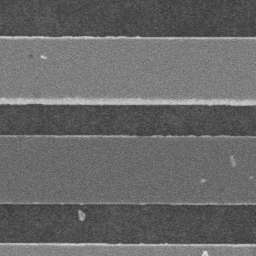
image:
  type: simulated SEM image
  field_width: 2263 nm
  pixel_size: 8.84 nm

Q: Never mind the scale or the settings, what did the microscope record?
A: lines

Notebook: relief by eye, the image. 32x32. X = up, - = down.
--------------------------------
--------------------------------
--------------------------------
--------------------------------
--------------------------------
XXXXXXXXXXXXXXXXXXXXXXXXXXXXXXXX
XXXXXXXXXXXXXXXXXXXXXXXXXXXXXXXX
XXXXXXXXXXXXXXXXXXXXXXXXXXXXXXXX
XXXXXXXXXXXXXXXXXXXXXXXXXXXXXXXX
XXXXXXXXXXXXXXXXXXXXXXXXXXXXXXXX
XXXXXXXXXXXXXXXXXXXXXXXXXXXXXXXX
XXXXXXXXXXXXXXXXXXXXXXXXXXXXXXXX
XXXXXXXXXXXXXXXXXXXXXXXXXXXXXXXX
--------------------------------
--------------------------------
--------------------------------
--------------------------------
XXXXXXXXXXXXXXXXXXXXXXXXXXXXXXXX
XXXXXXXXXXXXXXXXXXXXXXXXXXXXXXXX
XXXXXXXXXXXXXXXXXXXXXXXXXXXXXXXX
XXXXXXXXXXXXXXXXXXXXXXXXXXXXXXXX
XXXXXXXXXXXXXXXXXXXXXXXXXXXXXXXX
XXXXXXXXXXXXXXXXXXXXXXXXXXXXXXXX
XXXXXXXXXXXXXXXXXXXXXXXXXXXXXXXX
XXXXXXXXXXXXXXXXXXXXXXXXXXXXXXXX
----------X------XX--XXXXXXXXXXX
--------------------------------
--------------------------------
--------------------------------
--------------------------------
XXXXXXXXXXXXXXX--X--X-----------
XXXXXXXXXXXXXXXXXXXXXXXXXXXXXXXX